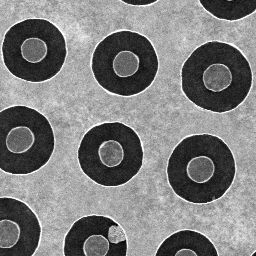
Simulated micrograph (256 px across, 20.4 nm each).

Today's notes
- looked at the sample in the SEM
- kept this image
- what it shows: ring-shaped grooves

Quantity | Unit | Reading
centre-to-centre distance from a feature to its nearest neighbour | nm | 1870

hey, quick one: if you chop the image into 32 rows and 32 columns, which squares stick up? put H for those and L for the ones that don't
HHHHHHHHHHHHHHHHLLLHHHHHHLLLLLLL
HHHHHHHHHHHHHHHHHHHHHHHHHHLLLLLL
HHHLLLHHHHHHHHHHHHHHHHHHHHHHLHHH
HLLLLLLHHHHHHHHHHHHHHHHHHHHHHHHH
HLLLLLLLHHHHHLLLLLHHHHHHHHHHHHHH
LLLHHHLLHHHHLLLLLLLHHHHHHLLLLHHH
LLLHHHLLHHHHLLLHLLLHHHHHLLLLLLHH
LLLHHLLLHHHLLLHHHLLLHHHLLLLLLLLH
HLLLLLLLHHHHLLHHHLLLHHHLLLHHLLLH
HHLLLLLHHHHHLLLHLLLHHHHLLHHHHLLL
HHHHHHHHHHHHLLLLLLLHHHHLLLHHHLLH
HHHHHHHHHHHHHHLLLLHHHHHLLLLLLLLH
HHHHHHHHHHHHHHHHHHHHHHHHLLLLLLHH
HLLLHHHHHHHHHHHHHHHHHHHHHLLLLHHH
LLLLLHHHHHHHHHHHHHHHHHHHHHHHHHHH
LLLLLLHHHHHHHLLHHHHHHHHHHHHHHHHH
LHHHLLLHHHHLLLLLLHHHHHHHHHHHHHHH
LHHHLLLHHHLLLLLLLLHHHHHLLLLLHHHH
LHHHLLLHHHLLLHHLLLHHHHLLLLLLLHHH
LLLLLLHHHHLLHHHLLLHHHLLLLLLLLHHH
LLLLLLHHHHLLLHHLLLHHHLLLHHHLLHHH
HLLLHHHHHHLLLLLLLHHHHLLHHHHLLHHH
HHHHHHHHHHHHLLLLHHHHHLLLHHLLLHHH
HHHHHHHHHHHHHHHHHHHHHLLLLLLLLHHH
HHHHHHHHHHHHHHHHHHHHHHLLLLLLHHHH
LLLHHHHHHHHHHHHHHHHHHHHHHHHHHHHH
LLLLHHHHHHHHHHHHHHHHHHHHHHHHHHHH
LLLLLHHHHHLLLLHHHHHHHHHHHHHHHHHH
HHLLLHHHHLLLLLLHHHHHHHHHHHHHHHHH
HHLLLHHHLLLLHLLLHHHHHLLLLLHHHHHH
HHLLLHHHLLLHHHLLHHHHLLLLLLLHHHHH
LLLLHHHHLLLHHLLLHHHHLLHHLLLHHHHH